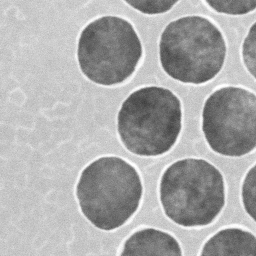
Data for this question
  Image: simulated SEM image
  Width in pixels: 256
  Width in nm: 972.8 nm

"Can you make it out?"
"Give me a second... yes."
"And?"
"holes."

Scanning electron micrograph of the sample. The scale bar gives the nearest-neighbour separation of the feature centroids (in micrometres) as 0.312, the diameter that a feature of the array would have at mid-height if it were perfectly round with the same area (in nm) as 261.